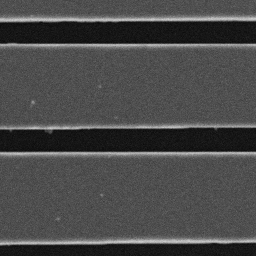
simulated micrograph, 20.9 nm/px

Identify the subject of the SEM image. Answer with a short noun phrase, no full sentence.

lines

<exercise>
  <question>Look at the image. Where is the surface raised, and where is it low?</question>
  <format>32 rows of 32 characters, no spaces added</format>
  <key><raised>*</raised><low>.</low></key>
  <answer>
********************************
********************************
**************************....**
................................
................................
.*..............................
********************************
********************************
********************************
********************************
********************************
********************************
********************************
********************************
********************************
********************************
................................
................................
................................
********************************
********************************
********************************
********************************
********************************
********************************
********************************
********************************
********************************
********************************
********************************
**********......................
................................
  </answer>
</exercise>